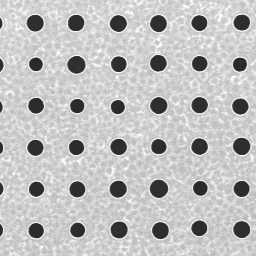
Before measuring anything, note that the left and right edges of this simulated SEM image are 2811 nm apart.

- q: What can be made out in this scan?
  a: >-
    a regular array of holes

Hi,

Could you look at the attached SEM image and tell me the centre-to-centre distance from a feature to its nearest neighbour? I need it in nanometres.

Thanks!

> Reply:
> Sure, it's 446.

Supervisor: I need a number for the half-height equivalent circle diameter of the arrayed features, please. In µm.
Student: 0.176